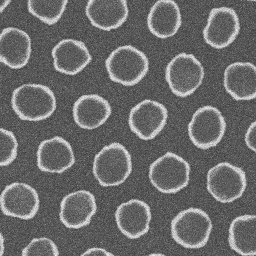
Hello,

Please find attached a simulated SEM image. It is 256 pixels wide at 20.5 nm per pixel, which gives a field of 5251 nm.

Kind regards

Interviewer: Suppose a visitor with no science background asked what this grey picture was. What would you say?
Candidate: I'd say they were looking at a regular array of raised bodies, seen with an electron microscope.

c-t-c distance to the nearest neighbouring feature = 1170 nm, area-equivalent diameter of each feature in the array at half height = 733 nanometres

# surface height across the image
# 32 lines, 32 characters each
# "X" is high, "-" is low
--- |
X---XXXX---XXXXX----XX----------
----XXXX---XXXXX---XXX-----XX---
------X----XXXX----XXX----XXXX--
-------------X-----XXX----XXXX--
XXX-----------------X-----XXX---
XXXX---XXX----------------XX----
XXXX---XXXX---XXX---------------
XXX----XXXX---XXXX----XX--------
-------XXX----XXXX---XXXX---XXXX
--------------XXXX---XXXX---XXXX
---------------------XXXX---XXXX
--XXXX----------------XX-----XXX
--XXXXX---XXX-------------------
--XXXXX--XXXXX---XXX------------
---XXX---XXXX---XXXXX---XXXX----
----------XXX---XXXX----XXXX----
X----------------XXX----XXXX---X
XX----XX----------------XXX----X
XX---XXXX----XX----------------X
XX---XXXX---XXXX-----X----------
-----XXXX---XXXX---XXXX---------
------------XXXX---XXXX---XXXX--
------------XXXX---XXXX---XXXXX-
-XXX----------------XXX---XXXX--
XXXX-----XX----------------XXX--
XXXXX---XXXX----XX--------------
-XXX----XXXX---XXXX----XX-------
--------XXX----XXXX---XXXX---XXX
---------------XXX----XXXX---XXX
----------------X-----XXXX---XXX
----XXX----------------XX----XXX
---XXXX----XX-----------------XX